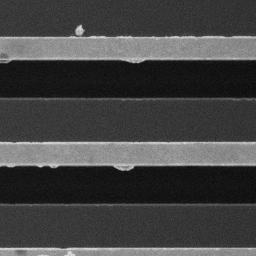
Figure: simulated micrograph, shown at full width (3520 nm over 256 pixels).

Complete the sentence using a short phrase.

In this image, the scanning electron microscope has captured lines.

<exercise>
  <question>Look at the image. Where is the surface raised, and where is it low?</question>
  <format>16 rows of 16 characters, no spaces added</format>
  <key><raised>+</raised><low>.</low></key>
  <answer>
++++++++++++++++
++++++++++++++++
++++++++++++++++
++++++++++++++++
................
................
++++++++++++++++
++++++++++++++++
++++++++++++++++
++++++++++++++++
.......+........
................
................
++++++++++++++++
++++++++++++++++
++++++++++++++++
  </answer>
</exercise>